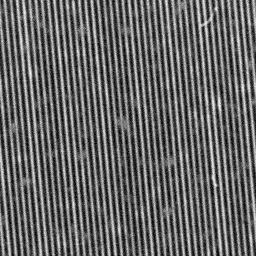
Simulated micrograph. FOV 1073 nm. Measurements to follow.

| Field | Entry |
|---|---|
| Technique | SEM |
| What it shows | parallel lines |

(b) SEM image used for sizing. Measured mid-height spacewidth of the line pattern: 19.8 nanometers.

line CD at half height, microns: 0.0062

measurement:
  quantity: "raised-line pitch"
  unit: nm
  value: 25.9